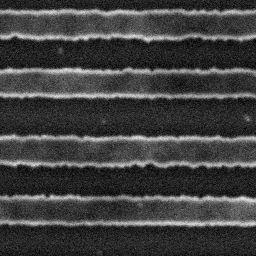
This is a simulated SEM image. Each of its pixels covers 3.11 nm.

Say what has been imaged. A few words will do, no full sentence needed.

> lines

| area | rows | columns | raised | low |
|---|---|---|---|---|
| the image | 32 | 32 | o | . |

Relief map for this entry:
................................
oooooooooooooooooooooooooooooooo
oooooooooooooooooooooooooooooooo
oooooooooooooooooooooooooooooooo
oooooooooooooooooooooooooooooooo
................................
................................
................................
................................
oooooooooooooooooooooooooooooooo
oooooooooooooooooooooooooooooooo
oooooooooooooooooooooooooooooooo
................................
................................
................................
................................
................................
oooooooooooooooooooooooooooooooo
oooooooooooooooooooooooooooooooo
oooooooooooooooooooooooooooooooo
.o.ooooooooooooooo.ooooooooooooo
................................
................................
................................
........o.......................
oooooooooooooooooooooooooooooooo
oooooooooooooooooooooooooooooooo
oooooooooooooooooooooooooooooooo
................................
................................
................................
................................